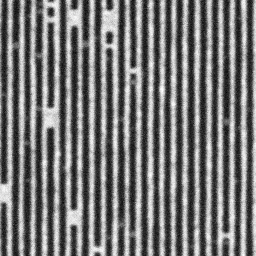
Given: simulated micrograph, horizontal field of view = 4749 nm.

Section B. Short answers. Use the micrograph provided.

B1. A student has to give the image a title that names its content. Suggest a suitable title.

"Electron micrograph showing parallel lines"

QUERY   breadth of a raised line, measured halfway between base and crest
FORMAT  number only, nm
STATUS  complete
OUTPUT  62.6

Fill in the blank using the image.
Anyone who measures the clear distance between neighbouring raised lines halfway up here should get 153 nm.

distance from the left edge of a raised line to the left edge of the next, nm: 217